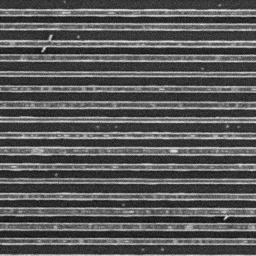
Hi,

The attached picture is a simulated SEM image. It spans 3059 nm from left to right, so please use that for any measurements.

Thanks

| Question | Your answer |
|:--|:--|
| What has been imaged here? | parallel lines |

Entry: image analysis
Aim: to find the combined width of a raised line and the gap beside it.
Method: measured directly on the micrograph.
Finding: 182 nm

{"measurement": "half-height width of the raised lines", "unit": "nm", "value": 68.7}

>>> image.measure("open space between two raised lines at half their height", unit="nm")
114